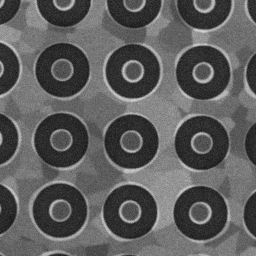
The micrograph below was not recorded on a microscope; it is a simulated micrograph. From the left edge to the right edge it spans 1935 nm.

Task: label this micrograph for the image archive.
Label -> an array of small figures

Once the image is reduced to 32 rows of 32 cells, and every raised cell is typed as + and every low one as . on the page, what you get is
...++..++..++...++..++..+++..++.
..+++......+++......++.......++.
.+++++....++++.....++++.....+++.
++++++++++++++++.+++++++...+++++
++++++++++++++++++++++++++++++++
.++++++..+++++++.+++++++++++++++
..+++.....++++.....++++.....++++
..+++..+...++.......++......+++.
...+..+++..++...++..++..++...++.
..++...++..++...++..++..++...++.
..+++......++.......++.......++.
.+++++....++++.....++++.....+++.
++++++++++++++++.+++++++++++++++
++++++++++++++++++++++++++++++++
.+++++...++++++...++++++..++++++
..+++......+++.....++++.....++++
..++...+...++...+...++......+++.
..++..+++..++..+++..++..++...++.
..++...+...++..++...++..++...++.
..+++......++......+++......+++.
++++++....++++.....++++....+++++
++++++++++++++++++++++++++++++++
++++++++++++++++++++++++++++++++
.++++....+++++....++++++..++++++
..++......+++......+++......+++.
..++...++..++..++...++..++..+++.
..++..+++..++..++...++..++...+..
..++...+...++...+...++..++...+..
.++++.....+++......+++......+++.
++++++...+++++....+++++....+++++
++++++++++++++++++++++++++++++++
++++++++++++++++++++++++++++++++